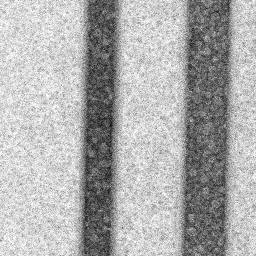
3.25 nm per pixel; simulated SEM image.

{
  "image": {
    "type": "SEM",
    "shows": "one or a few lines or trenches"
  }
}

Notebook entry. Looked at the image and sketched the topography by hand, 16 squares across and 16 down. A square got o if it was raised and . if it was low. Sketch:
ooooo...ooo....o
ooooo...ooo....o
ooooo...ooo....o
ooooo...ooo....o
ooooo..oooo....o
ooooo..oooo....o
ooooo..oooo....o
ooooo..oooo....o
ooooo..oooo....o
ooooo..oooo...oo
ooooo..oooo...oo
ooooo..oooo...oo
ooooo..oooo...oo
ooooo..oooo...oo
ooooo..oooo...oo
ooooo..oooo...oo